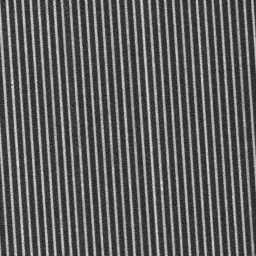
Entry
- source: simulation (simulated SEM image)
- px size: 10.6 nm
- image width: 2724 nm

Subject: parallel lines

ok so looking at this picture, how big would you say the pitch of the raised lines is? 84 nanometres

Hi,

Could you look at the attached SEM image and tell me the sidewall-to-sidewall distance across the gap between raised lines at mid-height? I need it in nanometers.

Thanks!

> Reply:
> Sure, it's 63.7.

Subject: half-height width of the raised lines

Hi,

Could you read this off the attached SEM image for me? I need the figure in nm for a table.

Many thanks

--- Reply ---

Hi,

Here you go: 18.6